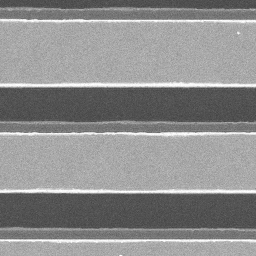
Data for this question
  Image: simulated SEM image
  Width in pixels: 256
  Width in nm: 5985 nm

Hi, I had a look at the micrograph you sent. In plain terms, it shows lines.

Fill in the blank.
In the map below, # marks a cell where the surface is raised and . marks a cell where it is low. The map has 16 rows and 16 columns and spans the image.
................
################
################
################
################
................
................
................
################
################
################
################
................
................
................
################